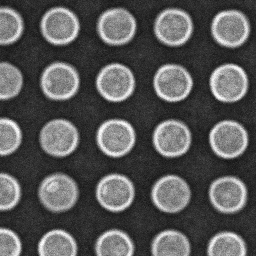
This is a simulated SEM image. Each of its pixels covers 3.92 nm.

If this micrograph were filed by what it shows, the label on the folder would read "a regular array of raised bodies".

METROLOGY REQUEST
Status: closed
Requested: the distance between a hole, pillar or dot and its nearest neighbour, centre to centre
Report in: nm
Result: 216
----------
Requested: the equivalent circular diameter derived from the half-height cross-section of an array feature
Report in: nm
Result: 146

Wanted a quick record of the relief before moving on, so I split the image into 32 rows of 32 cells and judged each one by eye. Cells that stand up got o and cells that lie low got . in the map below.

................................
oo....ooo....ooo....ooo.....oo..
ooo..ooooo..ooooo...oooo...oooo.
ooo..ooooo..ooooo..ooooo..ooooo.
oo....ooo....oooo...oooo...oooo.
o......o.............oo.....oo..
................................
................................
oo....ooo....ooo....ooo....ooo..
ooo..ooooo..ooooo..ooooo...oooo.
ooo..ooooo..ooooo..ooooo..ooooo.
oo....ooo...oooo....oooo...oooo.
..............o......o......oo..
................................
................................
oo....ooo....ooo....ooo....ooo..
oo...ooooo..ooooo..ooooo..ooooo.
ooo..ooooo..ooooo..ooooo..ooooo.
oo...oooo....ooo....ooo....oooo.
.....................o.....ooo..
................................
................................
oo....ooo....ooo....ooo....ooo..
oo...ooooo..ooooo..ooooo..ooooo.
oo...ooooo..ooooo..ooooo..ooooo.
oo....ooo....ooo...oooo....ooo..
.....................o......o...
................................
................................
oo....ooo....ooo....ooo....ooo..
oo...oooo...oooo...ooooo..ooooo.
oo...oooo...ooooo..ooooo..ooooo.